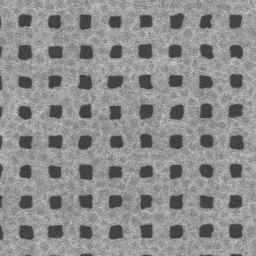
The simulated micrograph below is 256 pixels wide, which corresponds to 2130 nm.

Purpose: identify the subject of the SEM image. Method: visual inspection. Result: a regular array of holes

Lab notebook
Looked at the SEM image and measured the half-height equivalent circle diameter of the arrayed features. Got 118 nm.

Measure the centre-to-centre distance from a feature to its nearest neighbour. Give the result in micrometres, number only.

0.242